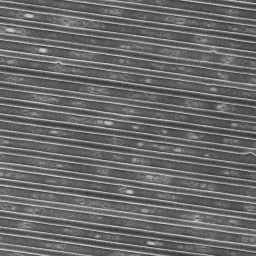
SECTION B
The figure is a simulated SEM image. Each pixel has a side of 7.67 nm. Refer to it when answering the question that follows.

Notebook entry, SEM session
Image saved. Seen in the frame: parallel lines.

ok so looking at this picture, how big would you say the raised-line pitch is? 123 nm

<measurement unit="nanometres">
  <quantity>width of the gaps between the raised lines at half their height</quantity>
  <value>67.5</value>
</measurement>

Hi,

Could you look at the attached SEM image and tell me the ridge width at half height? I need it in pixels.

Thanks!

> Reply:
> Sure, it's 6.81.